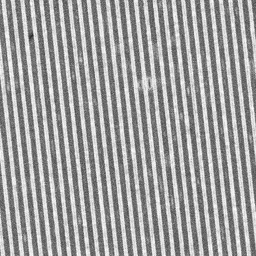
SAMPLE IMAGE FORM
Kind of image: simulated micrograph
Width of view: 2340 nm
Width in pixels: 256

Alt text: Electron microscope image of parallel lines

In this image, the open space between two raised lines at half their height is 0.0613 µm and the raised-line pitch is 85.9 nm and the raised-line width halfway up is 2.48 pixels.